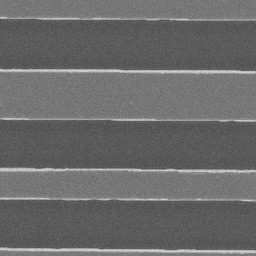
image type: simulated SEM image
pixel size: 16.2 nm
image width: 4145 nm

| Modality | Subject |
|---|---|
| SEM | lines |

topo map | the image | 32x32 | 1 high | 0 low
11111111111111111111111111111111
11111111111111111111111111111111
00000000000000000000000000000000
00000000000000000000000000000000
00000000000000000000000000000000
00000000000000000000000000000000
00000000000000000000000000000000
00000000000000000000000000000000
00000000000000000000000000000000
11111111111111111111111111111111
11111111111111111111111111111111
11111111111111111111111111111111
11111111111111111111111111111111
11111111111111111111111111111111
11111111111111111111111111111111
00000000000000000000000000000000
00000000000000000000000000000000
00000000000000000000000000000000
00000000000000000000000000000000
00000000000000000000000000000000
00000000000000000000000000000000
11111111111111111111111111111111
11111111111111111111111111111111
11111111111111111111111111111111
11111111111111111111111111111111
00000000000000000000000000000000
00000000000000000000000000000000
00000000000000000000000000000000
00000000000000000000000000000000
00000000000000000000000000000000
00000000000000000000000000000000
11111111111111111111111111111111